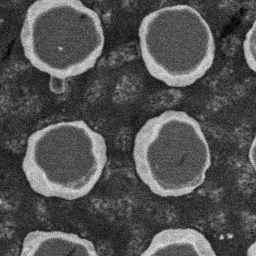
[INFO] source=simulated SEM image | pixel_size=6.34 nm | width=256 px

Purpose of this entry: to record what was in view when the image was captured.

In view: raised bodies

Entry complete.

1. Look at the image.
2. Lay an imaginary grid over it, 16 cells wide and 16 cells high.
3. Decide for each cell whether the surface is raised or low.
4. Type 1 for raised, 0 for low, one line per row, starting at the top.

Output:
0011100000110000
0011110001111000
0111110001111001
0011110001111001
0001100000111000
0000000000000000
0000000000000000
0000000000110000
0011110001111000
0011110001111000
0011110001111000
0011110000110000
0000000000000000
0000000000000000
0000000000110000
0011100001111000